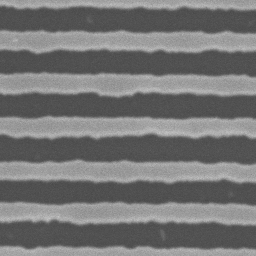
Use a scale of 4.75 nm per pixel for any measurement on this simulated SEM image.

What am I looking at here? lines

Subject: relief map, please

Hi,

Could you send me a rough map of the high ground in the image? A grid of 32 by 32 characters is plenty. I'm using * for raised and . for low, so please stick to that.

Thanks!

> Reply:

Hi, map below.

********************************
................................
................................
................................
********************************
********************************
....**.................**.......
................................
................................
**************************.****.
********************************
********************************
................................
................................
................................
********************************
********************************
................................
................................
................................
**************************.***..
********************************
.....**.**.******.*******....***
................................
................................
*****....*******.*..*****.*..*..
********************************
***.**.*************************
................................
................................
................................
********************************